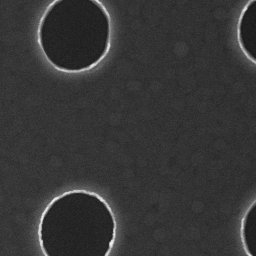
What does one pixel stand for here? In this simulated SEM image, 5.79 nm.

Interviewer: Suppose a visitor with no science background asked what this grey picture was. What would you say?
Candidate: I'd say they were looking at holes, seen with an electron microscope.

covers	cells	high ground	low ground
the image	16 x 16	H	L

HHHLLLHHHHHHHHHH
HHHLLLLHHHHHHHHL
HHHLLLLHHHHHHHHL
HHHLLLHHHHHHHHHH
HHHHHHHHHHHHHHHH
HHHHHHHHHHHHHHHH
HHHHHHHHHHHHHHHH
HHHHHHHHHHHHHHHH
HHHHHHHHHHHHHHHH
HHHHHHHHHHHHHHHH
HHHHHHHHHHHHHHHH
HHHHHHHHHHHHHHHH
HHHHLLHHHHHHHHHH
HHHLLLLHHHHHHHHL
HHHLLLLHHHHHHHHL
HHHLLLLHHHHHHHHL